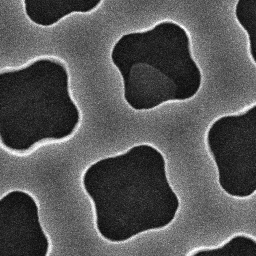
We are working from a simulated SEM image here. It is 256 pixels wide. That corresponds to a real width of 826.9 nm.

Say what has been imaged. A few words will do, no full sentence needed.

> holes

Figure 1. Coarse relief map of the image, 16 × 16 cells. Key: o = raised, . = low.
oo....ooooooooo.
oo.ooooooo.oooo.
ooooooo.....oooo
ooooooo.....oooo
....ooo.....oooo
....oooo....oooo
.....ooo..oooooo
.....ooooooooo..
....ooooooooo...
oooooooo..ooo...
oooooo....oooo..
ooooo......ooo..
..oooo.....ooooo
..oooo.....ooooo
...ooo...ooooooo
...oooooooooo...